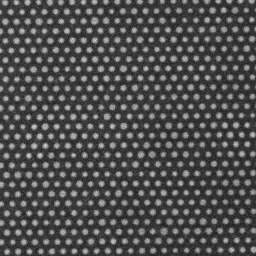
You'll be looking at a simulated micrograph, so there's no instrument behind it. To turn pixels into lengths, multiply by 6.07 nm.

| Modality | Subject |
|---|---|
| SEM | a regular array of raised bodies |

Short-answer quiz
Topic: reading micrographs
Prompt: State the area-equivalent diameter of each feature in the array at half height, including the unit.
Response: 0.0314 micrometres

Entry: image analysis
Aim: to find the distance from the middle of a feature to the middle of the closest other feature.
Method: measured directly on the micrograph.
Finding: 10.9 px